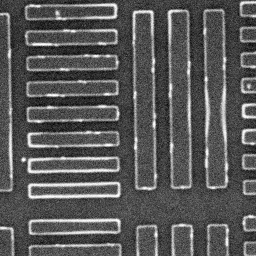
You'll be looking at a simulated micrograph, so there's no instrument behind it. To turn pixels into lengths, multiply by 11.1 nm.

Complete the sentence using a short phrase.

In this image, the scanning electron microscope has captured groups of lines, slits or small figures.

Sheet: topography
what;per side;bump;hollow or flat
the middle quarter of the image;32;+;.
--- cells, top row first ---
+++++++++++++.....++++.....++++.
..................++++.....++++.
..................++++.....++++.
..................++++.....++++.
+++++++++++++.....++++.....++++.
+++++++++++++.....+++++....++++.
+++++++++++++.....+++++....++++.
+++++++++++++.....+++++....++++.
..................+++++....++++.
..................+++++....++++.
..................+++++....++++.
+++++++++++++.....+++++....++++.
+++++++++++++.....+++++....++++.
+++++++++++++.....+++++....++++.
..................+++++....++++.
..................+++++....++++.
..................+++++....++++.
+++++++++++++.....+++++....++++.
+++++++++++++.....+++++....++++.
+++++++++++++.....+++++....+++++
++++..............+++++....+++++
..................+++++....+++++
..................+++++....+++++
............+.....+++++....+++++
++++++++++++++....+++++....+++++
++++++++++++++....+++++....+++++
+++++++++++++.....+++++....+++++
..................+++++....+++++
..................+++++....+++++
..................+++++....+++++
++++++++++++++....+++++....+++++
++++++++++++++..................